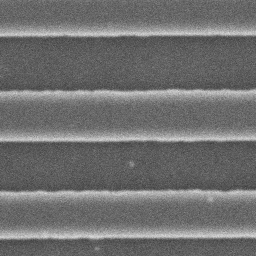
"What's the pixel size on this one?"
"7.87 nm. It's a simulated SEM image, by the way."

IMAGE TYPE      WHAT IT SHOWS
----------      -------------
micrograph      lines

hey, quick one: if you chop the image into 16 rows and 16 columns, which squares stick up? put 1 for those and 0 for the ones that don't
1111111111111111
1111111111111111
0000000000000000
0000000000000000
0000000000000000
0000000000000000
1111111111111111
1111111111111111
1111111111111111
0000000000000000
0000000000000000
0000000000000000
1111111111111111
1111111111111111
1111111111111111
0000000000000000